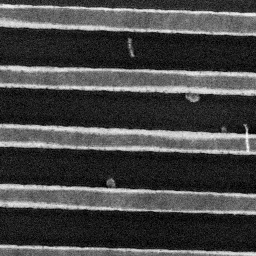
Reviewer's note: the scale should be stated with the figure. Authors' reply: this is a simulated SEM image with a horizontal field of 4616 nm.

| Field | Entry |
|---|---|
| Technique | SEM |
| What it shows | lines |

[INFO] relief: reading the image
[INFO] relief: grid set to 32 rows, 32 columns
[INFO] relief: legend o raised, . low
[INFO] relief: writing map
................................
oooooooooooooooooooooooooo......
oooooooooooooooooooooooooooooooo
.........ooooooooooooooooooooooo
................................
................................
................................
................................
oooo............................
oooooooooooooooooooooooooooooooo
oooooooooooooooooooooooooooooooo
........................oooooooo
................................
................................
................................
................................
ooooooooooooooooooooo...........
oooooooooooooooooooooooooooooooo
..........oooooooooooooooooooooo
................................
................................
................................
................................
oooooooooo......................
oooooooooooooooooooooooooooooooo
oooooooooooooooooooooooooooooooo
.......................ooooooooo
................................
................................
................................
................................
oooooooooooooooooooooooooooo....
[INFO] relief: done